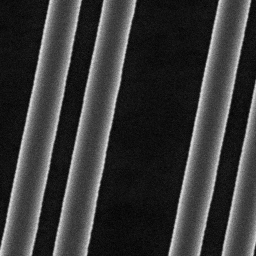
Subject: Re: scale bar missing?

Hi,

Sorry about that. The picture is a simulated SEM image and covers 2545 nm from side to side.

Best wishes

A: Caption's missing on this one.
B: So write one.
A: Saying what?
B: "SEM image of lines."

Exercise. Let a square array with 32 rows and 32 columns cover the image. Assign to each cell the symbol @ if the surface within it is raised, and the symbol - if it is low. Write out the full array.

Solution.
------@@@@---@@@@----------@@@@-
------@@@@---@@@@----------@@@@-
------@@@@---@@@-----------@@@@-
------@@@@--@@@@-----------@@@@-
-----@@@@---@@@@-----------@@@--
-----@@@@---@@@@----------@@@@--
-----@@@@---@@@@----------@@@@--
-----@@@@--@@@@@----------@@@@--
-----@@@@--@@@@-----------@@@@--
----@@@@---@@@@----------@@@@---
----@@@@---@@@@----------@@@@---
----@@@@---@@@@----------@@@@---
----@@@@---@@@-----------@@@@---
----@@@@--@@@@-----------@@@@--@
---@@@@---@@@@----------@@@@---@
---@@@@---@@@@----------@@@@---@
---@@@@---@@@@----------@@@@---@
---@@@@--@@@@@----------@@@@---@
---@@@@--@@@@-----------@@@@--@@
--@@@@---@@@@-----------@@@---@@
--@@@@---@@@@----------@@@@---@@
--@@@@---@@@@----------@@@@---@@
--@@@@--@@@@@----------@@@@---@@
--@@@@--@@@@-----------@@@@--@@@
-@@@@---@@@@-----------@@@@--@@@
-@@@@---@@@@----------@@@@---@@@
-@@@@---@@@@----------@@@@---@@@
-@@@@---@@@@----------@@@@---@@@
-@@@@--@@@@-----------@@@@--@@@@
@@@@---@@@@-----------@@@---@@@@
@@@@---@@@@----------@@@@---@@@@
@@@@---@@@@----------@@@@---@@@@